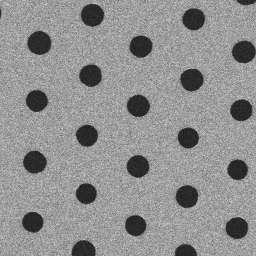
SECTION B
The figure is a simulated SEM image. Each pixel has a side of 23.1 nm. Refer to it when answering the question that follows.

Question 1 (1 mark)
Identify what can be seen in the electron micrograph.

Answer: a regular array of holes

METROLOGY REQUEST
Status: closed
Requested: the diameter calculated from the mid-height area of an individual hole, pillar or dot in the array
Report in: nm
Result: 515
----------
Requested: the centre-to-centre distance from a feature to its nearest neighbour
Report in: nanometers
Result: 1340